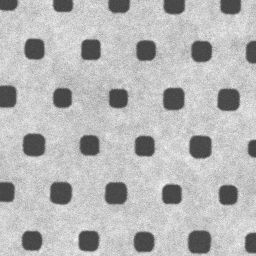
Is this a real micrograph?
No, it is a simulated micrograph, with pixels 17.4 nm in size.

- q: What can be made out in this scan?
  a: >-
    a regular array of holes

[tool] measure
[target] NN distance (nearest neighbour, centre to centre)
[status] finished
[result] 957 nm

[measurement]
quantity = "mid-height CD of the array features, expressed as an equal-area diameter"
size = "384 nanometres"